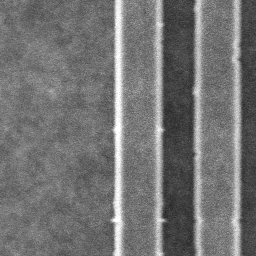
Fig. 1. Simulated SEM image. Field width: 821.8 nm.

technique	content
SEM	one or a few lines or trenches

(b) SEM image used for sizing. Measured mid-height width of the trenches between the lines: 116 nanometers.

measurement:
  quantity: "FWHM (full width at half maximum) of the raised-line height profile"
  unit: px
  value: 42.1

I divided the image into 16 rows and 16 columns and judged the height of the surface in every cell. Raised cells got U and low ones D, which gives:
DDDDDDDUUUDDUUUD
DDDDDDDUUUDDUUUD
DDDDDDDUUUDDUUUD
DDDDDDDUUUDDUUUD
DDDDDDDUUUDDUUUD
DDDDDDDUUUDDUUUD
DDDDDDDUUUDDUUUD
DDDDDDDUUUDDUUUD
DDDDDDDUUUDDUUUD
DDDDDDDUUUDDUUUD
DDDDDDDUUUDDUUUD
DDDDDDDUUUDDUUUD
DDDDDDDUUUDDUUUD
DDDDDDDUUUDDUUUD
DDDDDDDUUUDDUUUD
DDDDDDDUUUDDUUUD